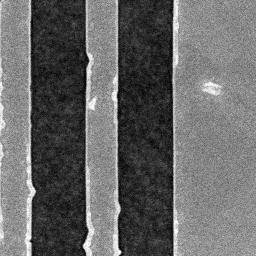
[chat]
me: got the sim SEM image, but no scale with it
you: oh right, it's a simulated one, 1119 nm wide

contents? one or a few lines or trenches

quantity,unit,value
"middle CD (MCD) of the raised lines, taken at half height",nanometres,133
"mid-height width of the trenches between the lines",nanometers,249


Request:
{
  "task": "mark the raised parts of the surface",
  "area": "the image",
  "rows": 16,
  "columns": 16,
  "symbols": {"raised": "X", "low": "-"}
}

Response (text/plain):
XX---XX----XXXXX
XX---XX----XXXXX
XX---XX----XXXXX
XX---XX----XXXXX
XX---XX----XXXXX
XX---XX----XXXXX
XX---XX----XXXXX
XX---XX----XXXXX
XX---XX----XXXXX
XX---XX----XXXXX
XX---XX----XXXXX
XX---XX----XXXXX
XX---XX----XXXXX
XX---XX----XXXXX
XX----X----XXXXX
XX---XX----XXXXX